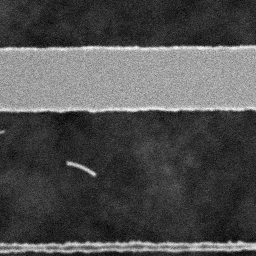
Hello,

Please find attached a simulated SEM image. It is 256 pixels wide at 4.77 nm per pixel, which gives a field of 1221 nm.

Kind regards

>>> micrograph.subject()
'lines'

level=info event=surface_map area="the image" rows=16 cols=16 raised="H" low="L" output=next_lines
LLLLLLLLLLLLLLLL
LLLLLLLLLLLLLLLL
LLLLLLLLLLLLLLLL
HHHHHHHHHHHHHHHH
HHHHHHHHHHHHHHHH
HHHHHHHHHHHHHHHH
HHHHHHHHHHHHHHHH
LLLLLLLLLLLLLLLL
LLLLLLLLLLLLLLLL
LLLLLLLLLLLLLLLL
LLLLLLLLLLLLLLLL
LLLLLLLLLLLLLLLL
LLLLLLLLLLLLLLLL
LLLLLLLLLLLLLLLL
LLLLLLLLLLLLLLLL
HLLHHHHHHLHHHHHL